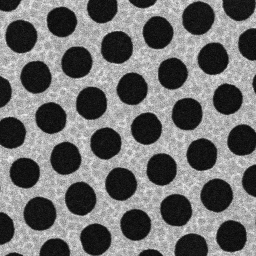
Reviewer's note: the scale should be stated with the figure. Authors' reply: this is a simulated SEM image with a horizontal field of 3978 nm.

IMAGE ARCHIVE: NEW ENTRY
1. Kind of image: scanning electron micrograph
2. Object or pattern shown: a regular array of holes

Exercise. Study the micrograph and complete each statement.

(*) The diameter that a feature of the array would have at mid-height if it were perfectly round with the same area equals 0.497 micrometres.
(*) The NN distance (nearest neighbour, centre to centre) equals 666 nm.